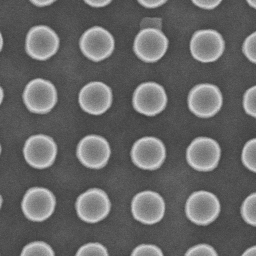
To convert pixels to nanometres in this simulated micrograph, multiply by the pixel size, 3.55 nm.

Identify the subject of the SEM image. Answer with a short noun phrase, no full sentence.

a regular array of raised bodies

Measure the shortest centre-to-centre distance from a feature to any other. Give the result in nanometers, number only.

189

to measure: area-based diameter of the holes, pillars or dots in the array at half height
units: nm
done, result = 115